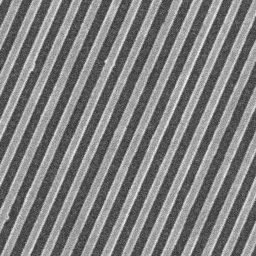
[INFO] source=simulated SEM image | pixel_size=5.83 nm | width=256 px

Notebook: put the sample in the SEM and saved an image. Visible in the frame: parallel lines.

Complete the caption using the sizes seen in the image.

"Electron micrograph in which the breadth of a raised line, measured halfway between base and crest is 7.8 px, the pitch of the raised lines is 107 nm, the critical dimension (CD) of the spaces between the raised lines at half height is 0.0654 um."